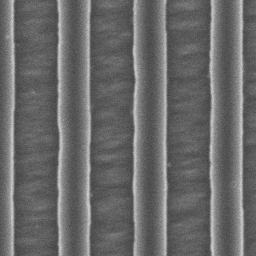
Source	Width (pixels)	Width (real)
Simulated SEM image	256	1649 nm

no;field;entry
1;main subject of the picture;lines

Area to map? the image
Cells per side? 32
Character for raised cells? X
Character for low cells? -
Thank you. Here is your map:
XX-----XXXX------XXXX------XXX--
XX-----XXXX------XXXX------XXX--
XX-----XXXX------XXXX------XXX--
XX-----XXXX------XXXX------XXX--
XX-----XXXX------XXXX-----XXXX--
XX-----XXXX------XXXX-----XXXX--
XX-----XXXX------XXXX-----XXXX--
XX-----XXXX------XXXX-----XXXX--
XX-----XXXX------XXXX-----XXXX--
XX-----XXXX------XXXX-----XXXX--
XX-----XXXX------XXXX-----XXXX--
XX-----XXXX------XXXX------XXX--
XX-----XXXX------XXXX------XXX--
XX-----XXXX------XXXX------XXX--
XX-----XXXX------XXXX------XXX--
XX-----XXXX------XXXX-----XXXX--
XX------XXX------XXXX-----XXXX--
XX------XXX------XXXX-----XXXX--
XX------XXX------XXXX-----XXXX--
XX-----XXXX------XXXX-----XXXX--
XX-----XXXX------XXXX-----XXXX--
XX-----XXXX------XXXX-----XXXX--
XX-----XXXX------XXXX-----XXXX--
XX-----XXXX------XXXX------XXX--
XX-----XXXX------XXXX------XXX--
XX-----XXXX------XXXX------XXX--
XX-----XXXX------XXXX------XXX--
XX-----XXXX------XXXX------XXX--
XX-----XXXX------XXXX------XXX--
XX-----XXXX------XXXX------XXX--
XX-----XXXX------XXXX------XXX--
XX-----XXXX------XXXX------XXX--